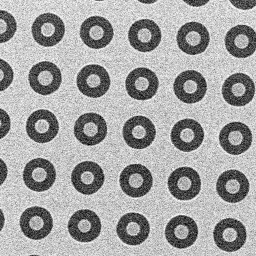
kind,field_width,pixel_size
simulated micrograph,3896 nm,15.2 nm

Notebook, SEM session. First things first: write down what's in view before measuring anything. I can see an array of small figures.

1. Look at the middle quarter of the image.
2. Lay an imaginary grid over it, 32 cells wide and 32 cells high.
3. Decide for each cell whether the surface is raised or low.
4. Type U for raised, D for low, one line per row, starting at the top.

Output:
UUUUUDDDDDUUUUUUUUUUUUUUUUUUUUUU
UUUUDDDDDDDUUUUUUDDDDDUUUUUUUUUD
UUUDDDDDDDDUUUUUDDDDDDDUUUUUUDDD
UUUDDDUUUDDDUUUDDDDUDDDDUUUUDDDD
UUUDDDUUUDDDUUUDDDUUUDDDUUUDDDDU
UUUDDDUUDDDDUUUDDDUUUDDDUUUDDDUU
UUUUDDDDDDDUUUUDDDDUDDDUUUUDDDUU
UUUUUDDDDDUUUUUUDDDDDDDUUUUUDDDD
UUUUUUUDUUUUUUUUUDDDDDUUUUUUDDDD
UUUUUUUUUUUUUUUUUUUUUUUUUUUUUUDD
UUUUUUUUUUUUUUUUUUUUUUUUUUUUUUUU
UUUUUUUUUUUUUUUUUUUUUUUUUUUUUUUU
UUUUUDDDDUUUUUUUUUUUUUUUUUUUUUUU
UUUDDDDDDDUUUUUUDDDDDUUUUUUUUUUU
UUUDDDDDDDDUUUUDDDDDDDUUUUUUDDDD
UUDDDUUUDDDUUUUDDDDDDDDUUUUDDDDD
UUDDDUUUDDDUUUDDDUUUDDDUUUUDDDUU
UUDDDDUUDDDUUUUDDUUUDDDUUUDDDUUU
UUUDDDDDDDUUUUUDDDDDDDDUUUUDDUUU
UUUUDDDDDUUUUUUDDDDDDDUUUUUDDDDD
UUUUUUDUUUUUUUUUDDDDDUUUUUUDDDDD
UUUUUUUUUUUUUUUUUUUUUUUUUUUUUDDD
UUUUUUUUUUUUUUUUUUUUUUUUUUUUUUUU
UUUUUUUUUUUUUUUUUUUUUUUUUUUUUUUU
UUUUDDDUUUUUUUUUUUUUUUUUUUUUUUUU
UUUDDDDDDUUUUUUDDDDDUUUUUUUUUUUU
UUDDDDDDDDUUUUUDDDDDDUUUUUUDDDDD
UUDDDUUDDDUUUUDDDDDDDDUUUUDDDDDD
UUDDUUUDDDUUUUDDDUUDDDUUUUDDDUUD
UUDDDUUDDDUUUUDDUUUUDDUUUUDDDUUU
UUDDDDDDDDUUUUDDDUUDDDUUUUDDDUUU
UUUDDDDDDUUUUUDDDDDDDDUUUUDDDDDD